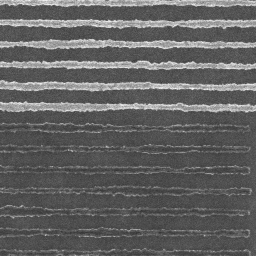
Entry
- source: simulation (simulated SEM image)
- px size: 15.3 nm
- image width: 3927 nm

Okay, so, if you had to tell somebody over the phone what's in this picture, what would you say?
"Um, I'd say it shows parallel lines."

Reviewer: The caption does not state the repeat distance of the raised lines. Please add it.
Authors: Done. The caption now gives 321 nm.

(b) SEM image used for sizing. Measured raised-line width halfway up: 82.5 nanometers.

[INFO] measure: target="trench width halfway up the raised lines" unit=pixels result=15.4